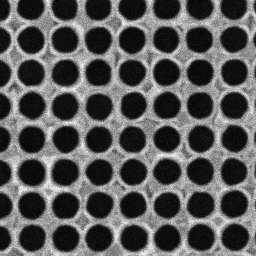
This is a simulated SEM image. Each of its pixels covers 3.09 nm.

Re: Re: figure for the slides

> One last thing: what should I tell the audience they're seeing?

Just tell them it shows a regular array of holes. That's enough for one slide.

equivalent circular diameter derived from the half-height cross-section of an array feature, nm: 83.4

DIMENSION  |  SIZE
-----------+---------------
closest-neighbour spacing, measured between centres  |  0.101 um